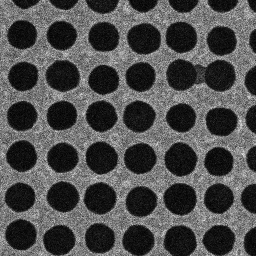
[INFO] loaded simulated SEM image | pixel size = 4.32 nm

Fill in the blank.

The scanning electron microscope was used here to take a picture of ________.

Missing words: a regular array of holes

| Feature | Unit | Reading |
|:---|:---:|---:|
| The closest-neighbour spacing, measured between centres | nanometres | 167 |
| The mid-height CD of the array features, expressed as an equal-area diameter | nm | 132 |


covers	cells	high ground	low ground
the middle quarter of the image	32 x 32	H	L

LLLHHHHHLLLLHHHHHLLLLLHHHHLLLLLL
LLLHHHHLLLLLLHHHLLLLLLHHHHLLLLLL
LLLLHHLLLLLLLLHLLLLLLLLHHLLLLLLL
LLLLHHLLLLLLLLHLLLLLLLLHHHLLLLLL
LLLLHHLLLLLLLLHHLLLLLLLHHHLLLLLL
LLLHHHLLLLLLLLHHLLLLLLHHHHHLLLLL
LHHHHHHLLLLLLHHHHLLLLHHHHHHHLLHH
HHHHHHHHHLLHHHHHHHHHHHHHHHHHHHHH
HHHHHHHHHHHHHHHHHHHHHHHHHHHHHHHH
LHHHHHHHLLLHHHHHHLLLHHHHHHHHHHHH
LLLHHHLLLLLLHHHHLLLLLLHHHHHLLLLH
LLLHHHLLLLLLLHHLLLLLLLHHHHLLLLLL
LLLHHHLLLLLLLHHLLLLLLLLHHHLLLLLL
LLLHHLLLLLLLLHHLLLLLLLLHHHLLLLLL
LLLHHHLLLLLLLHHLLLLLLLHHHHLLLLLL
LLHHHHHLLLLLHHHLLLLLLLHHHHLLLLLL
HHHHHHHHLLLHHHHHHLLLLHHHHHHLLLLH
HHHHHHHHHHHHHHHHHHHHHHHHHHHHHHHH
HHHHHHHHHHHHHHHHHHHHHHHHHHHHHHHH
HHHHHHHHLLHHHHHHHHHHHHHHHHHHHHHH
LLHHHHHLLLLLHHHHHLLLLLHHHHHLLLLH
LLLHHHLLLLLLLHHHLLLLLLHHHHLLLLLL
LLLHHLLLLLLLLHHLLLLLLLLHHLLLLLLL
LLLLHLLLLLLLLLHLLLLLLLLHHLLLLLLL
LLLLHHLLLLLLLHHLLLLLLLLHHLLLLLLL
LLLHHHLLLLLLLHHLLLLLLLLHHLLLLLLL
LLHHHHHLLLLLHHHHLLLLLLHHHHLLLLLL
HHHHHHHHLLHHHHHHHHLLHHHHHHHLLLLH
HHHHHHHHHHHHHHHHHHHHHHHHHHHHHHHH
HHHHHHHHHHHHHHHHHHHHHHHHHHHHHHHH
LLHHHHHLLLLHHHHHHHHHHHHHHHHLLLLH
LLLHHLLLLLLLHHHHHLLLLLHHHHLLLLLL